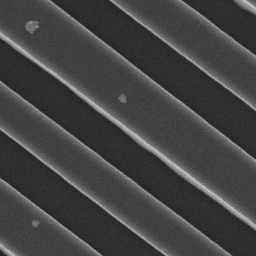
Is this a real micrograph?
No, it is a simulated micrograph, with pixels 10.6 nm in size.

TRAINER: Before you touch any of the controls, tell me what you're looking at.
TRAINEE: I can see lines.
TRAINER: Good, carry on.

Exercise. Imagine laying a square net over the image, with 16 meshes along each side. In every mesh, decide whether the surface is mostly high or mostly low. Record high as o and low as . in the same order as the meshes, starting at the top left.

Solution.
oooo....oooo....
ooooo....oooo...
oooooo....ooooo.
..oooooo....oooo
...oooooo....ooo
o....ooooo....oo
oo....ooooo.....
ooo....oooooo...
.oooo...oooooo..
..oooo....ooooo.
...oooo....ooooo
....ooooo...oooo
oo....oooo....oo
ooo....oooo....o
oooo....ooooo...
oooooo....oooo..